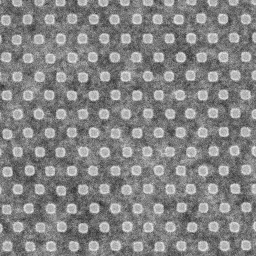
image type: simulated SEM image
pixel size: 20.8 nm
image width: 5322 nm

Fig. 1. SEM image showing a regular array of raised bodies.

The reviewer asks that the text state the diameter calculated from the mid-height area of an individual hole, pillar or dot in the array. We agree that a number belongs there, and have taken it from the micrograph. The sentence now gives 0.191 µm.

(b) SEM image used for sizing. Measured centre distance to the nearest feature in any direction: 0.439 um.